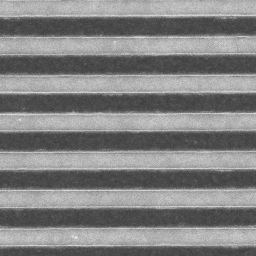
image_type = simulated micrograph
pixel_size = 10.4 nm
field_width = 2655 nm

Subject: parallel lines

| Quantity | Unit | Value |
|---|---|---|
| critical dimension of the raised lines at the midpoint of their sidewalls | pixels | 22.1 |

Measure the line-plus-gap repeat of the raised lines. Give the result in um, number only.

0.394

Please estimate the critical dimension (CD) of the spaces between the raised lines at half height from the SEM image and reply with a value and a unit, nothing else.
163 nanometres